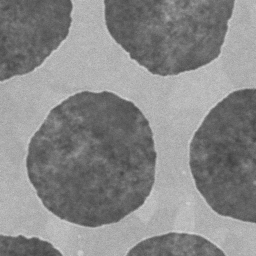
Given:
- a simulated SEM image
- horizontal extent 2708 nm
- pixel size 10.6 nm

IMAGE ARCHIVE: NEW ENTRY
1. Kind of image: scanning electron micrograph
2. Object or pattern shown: holes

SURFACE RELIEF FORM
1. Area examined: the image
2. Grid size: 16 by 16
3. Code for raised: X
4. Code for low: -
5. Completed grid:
-----X---------X
----XXX-------XX
----XXX-------XX
---XXXXX------XX
--XXXXXXX---XXXX
XXXXXXXXXXXXXXXX
XXXX----XXXXXX--
XXX------XXXX---
XX--------XX----
XX--------XX----
XX--------XX----
XX--------XX----
XX-------XXXX---
XXX-----XXXXXX--
XXXXXXXXXXXXXXXX
---XXXXX------XX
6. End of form